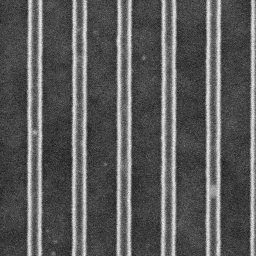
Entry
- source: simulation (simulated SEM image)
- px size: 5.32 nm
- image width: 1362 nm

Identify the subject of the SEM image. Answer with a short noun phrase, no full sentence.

parallel lines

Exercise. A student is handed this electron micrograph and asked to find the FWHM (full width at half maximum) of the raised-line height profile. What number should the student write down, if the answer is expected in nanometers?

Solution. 61.2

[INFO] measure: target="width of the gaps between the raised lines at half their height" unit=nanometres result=174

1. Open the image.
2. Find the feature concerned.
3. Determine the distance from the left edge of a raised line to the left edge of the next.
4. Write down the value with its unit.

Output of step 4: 0.237 micrometres